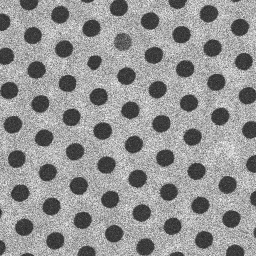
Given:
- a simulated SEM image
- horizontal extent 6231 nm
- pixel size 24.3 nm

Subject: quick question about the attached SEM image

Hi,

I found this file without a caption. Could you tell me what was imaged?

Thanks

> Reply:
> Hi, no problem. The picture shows a regular array of holes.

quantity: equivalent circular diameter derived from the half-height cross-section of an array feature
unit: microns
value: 0.441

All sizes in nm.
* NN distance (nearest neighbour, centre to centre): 826